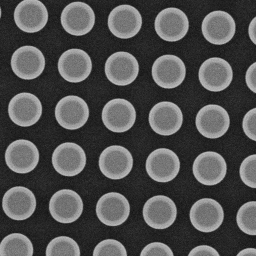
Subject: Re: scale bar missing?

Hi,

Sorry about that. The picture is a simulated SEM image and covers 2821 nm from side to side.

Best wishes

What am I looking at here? an array of small figures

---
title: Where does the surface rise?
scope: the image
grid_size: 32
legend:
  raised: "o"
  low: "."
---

..ooo....oo.....................
..oooo..oooo..ooo...ooo....o....
..oooo..oooo..oooo.oooo..oooo...
..ooo...ooo...oooo.ooooo.oooo..o
..............ooo...ooo..oooo..o
...........................o....
..ooo...ooo.....................
.ooooo.oooo..oooo...ooo...oo....
.ooooo.oooo..oooo..oooo..oooo..o
..ooo...ooo..oooo..oooo..oooo..o
..............oo....oo...oooo..o
................................
.oooo...oo....oo................
.oooo..oooo..oooo..ooo...ooo....
.oooo..oooo..oooo..oooo..oooo..o
..oo...oooo..oooo..oooo..oooo.oo
....................oo...ooo...o
..o.............................
.oooo..ooo...ooo................
.oooo..oooo..ooo...ooo...ooo...o
.oooo..oooo.ooooo.oooo..oooo..oo
..oo...ooo...ooo..oooo..oooo..oo
...................oo....ooo..oo
..o.............................
.ooo...ooo...oo.....o...........
oooo..oooo..oooo..oooo..ooo....o
.ooo..oooo..oooo..oooo..oooo..oo
..o....oo....ooo..oooo..oooo..oo
...................oo...ooo...oo
.oo.............................
oooo..oooo..ooo....o............
oooo..oooo..oooo..ooo...ooo...oo